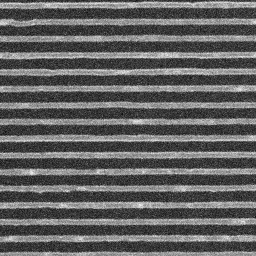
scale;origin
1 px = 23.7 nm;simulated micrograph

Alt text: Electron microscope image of parallel lines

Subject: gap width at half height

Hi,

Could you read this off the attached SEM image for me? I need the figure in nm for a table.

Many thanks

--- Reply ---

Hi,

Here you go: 273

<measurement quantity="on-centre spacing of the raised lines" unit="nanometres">395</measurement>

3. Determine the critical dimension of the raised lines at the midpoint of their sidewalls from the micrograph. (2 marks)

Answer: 119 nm